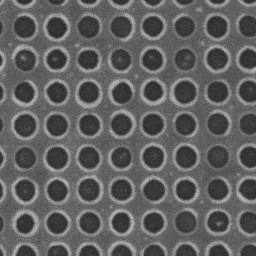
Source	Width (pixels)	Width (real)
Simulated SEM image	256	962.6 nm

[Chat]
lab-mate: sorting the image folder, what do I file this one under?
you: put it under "a regular array of holes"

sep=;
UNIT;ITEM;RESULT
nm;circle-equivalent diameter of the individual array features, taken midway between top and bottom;80.8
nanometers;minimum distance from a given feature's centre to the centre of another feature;120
